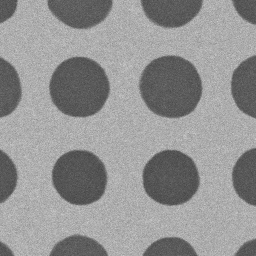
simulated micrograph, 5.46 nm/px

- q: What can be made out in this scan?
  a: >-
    holes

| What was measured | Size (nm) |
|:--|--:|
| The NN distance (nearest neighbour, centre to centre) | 494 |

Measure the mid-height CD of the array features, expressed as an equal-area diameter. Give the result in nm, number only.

318